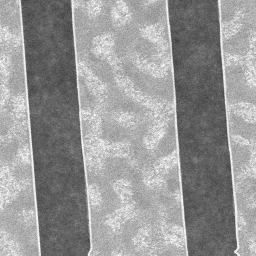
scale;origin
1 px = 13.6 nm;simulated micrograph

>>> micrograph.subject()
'one or a few lines or trenches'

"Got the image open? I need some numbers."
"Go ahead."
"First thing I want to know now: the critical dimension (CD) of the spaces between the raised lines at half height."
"703 nm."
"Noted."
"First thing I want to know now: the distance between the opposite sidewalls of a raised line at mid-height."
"1290 nm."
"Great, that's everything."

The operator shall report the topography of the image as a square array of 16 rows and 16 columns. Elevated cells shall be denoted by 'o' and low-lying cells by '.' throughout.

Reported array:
o....ooooo....oo
o....oooooo...oo
o....oooooo...oo
oo...oooooo...oo
oo...oooooo...oo
oo...oooooo...oo
oo...oooooo...oo
oo...oooooo...oo
oo...oooooo...oo
oo...oooooo...oo
oo...oooooo...oo
oo...oooooo....o
oo....ooooo....o
oo....ooooo....o
oo....oooooo...o
oo....oooooo...o